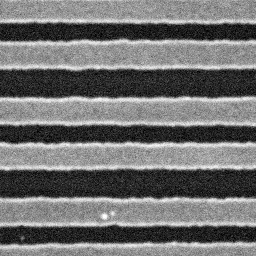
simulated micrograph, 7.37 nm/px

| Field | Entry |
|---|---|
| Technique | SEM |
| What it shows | lines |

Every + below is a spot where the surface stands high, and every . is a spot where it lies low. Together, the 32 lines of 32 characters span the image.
++++++++++++++++++++++++++++++++
++++++++++++++++++++++++++++++++
++++++++++++++++++++++++++++++++
................................
................................
++++++++++++++++++++++++++++++++
++++++++++++++++++++++++++++++++
++++++++++++++++++++++++++++++++
+.++.+..+++.+++.++++.....+++....
................................
................................
................................
++++++++++++++++++++++++++++++++
++++++++++++++++++++++++++++++++
++++++++++++++++++++++++++++++++
.+++....+++...+++.+++++++++.++++
................................
................................
++++++++++++++++++++++++++++++++
++++++++++++++++++++++++++++++++
++++++++++++++++++++++++++++++++
................................
................................
................................
................................
++++++++++++++++++++++++++++++++
++++++++++++++++++++++++++++++++
++++++++++++++++++++++++++++++++
................................
................................
..................+.+++++.++++++
++++++++++++++++++++++++++++++++